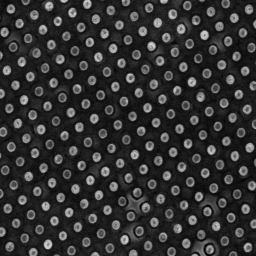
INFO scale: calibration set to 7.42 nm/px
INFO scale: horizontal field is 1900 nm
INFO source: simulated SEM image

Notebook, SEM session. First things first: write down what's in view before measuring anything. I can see a regular array of raised bodies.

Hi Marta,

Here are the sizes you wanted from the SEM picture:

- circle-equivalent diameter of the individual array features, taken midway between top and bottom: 59.8 nm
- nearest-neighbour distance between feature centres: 17 px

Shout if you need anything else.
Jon